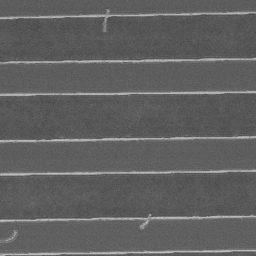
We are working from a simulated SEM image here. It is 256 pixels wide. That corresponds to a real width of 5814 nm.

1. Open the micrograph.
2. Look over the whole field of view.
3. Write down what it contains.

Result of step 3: lines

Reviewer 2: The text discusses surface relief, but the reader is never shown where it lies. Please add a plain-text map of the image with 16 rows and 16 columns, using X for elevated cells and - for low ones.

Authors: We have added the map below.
XXXXXXXXXXXXXXXX
----------------
----------------
----------------
XXXXXXXXXXXXXXXX
XXXXXXXXXXXXXXXX
----------------
----------------
----------------
XXXXXXXXXXXXXXXX
XXXXXXXXXXXXXXXX
----------------
----------------
----------------
XXXXXXXXXXXXXXXX
XXXXXXXXXXXXXXXX